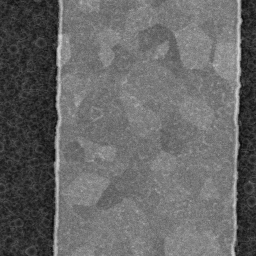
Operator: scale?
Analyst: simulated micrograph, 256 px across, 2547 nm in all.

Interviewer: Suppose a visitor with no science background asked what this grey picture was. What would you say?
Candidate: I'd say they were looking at one or a few lines or trenches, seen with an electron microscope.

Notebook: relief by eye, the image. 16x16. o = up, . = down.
....ooooooooooo.
....ooooooooooo.
....ooooooooooo.
....ooooooooooo.
....ooooooooooo.
....ooooooooooo.
....ooooooooooo.
....ooooooooooo.
....ooooooooooo.
....ooooooooooo.
....ooooooooooo.
....ooooooooooo.
....ooooooooooo.
....ooooooooooo.
...oooooooooooo.
...oooooooooooo.